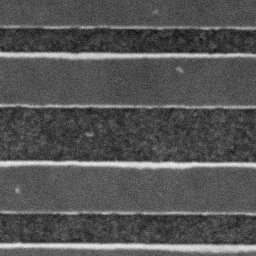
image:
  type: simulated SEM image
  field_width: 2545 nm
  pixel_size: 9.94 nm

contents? lines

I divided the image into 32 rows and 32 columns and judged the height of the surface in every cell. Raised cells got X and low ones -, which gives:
XXXXXXXXXXXXXXXXXXXXXXXXXXXXXXXX
XXXXXXXXXXXXXXXXXXXXXXXXXXXXXXXX
XXXXXXXXXXXXXXXXXXXXXXXXXXXXXXXX
-------------------XX----XXX-XXX
--------------------------------
--------------------------------
--------------------------------
XXXXXXXXXXXXXXXXXXXXXXXXXXXXXXXX
XXXXXXXXXXXXXXXXXXXXXXXXXXXXXXXX
XXXXXXXXXXXXXXXXXXXXXXXXXXXXXXXX
XXXXXXXXXXXXXXXXXXXXXXXXXXXXXXXX
XXXXXXXXXXXXXXXXXXXXXXXXXXXXXXXX
XXXXXXXXXXXXXXXXXXXXXXXXXXXXXXXX
--------------------------------
--------------------------------
--------------------------------
--------------------------------
--------------------------------
--------------------------------
--------------------------------
XXXXXXXXXXXXXXX-----------------
XXXXXXXXXXXXXXXXXXXXXXXXXXXXXXXX
XXXXXXXXXXXXXXXXXXXXXXXXXXXXXXXX
XXXXXXXXXXXXXXXXXXXXXXXXXXXXXXXX
XXXXXXXXXXXXXXXXXXXXXXXXXXXXXXXX
XXXXXXXXXXXXXXXXXXXXXXXXXXXXXXXX
XXXXXXXXXXXXXXXXXXXXXXXXXXXXXXXX
--------------------------------
--------------------------------
--------------------------------
--------------------------------
XXXXXXXXXXXXXXXXXXXXXXXXXXXXXXXX